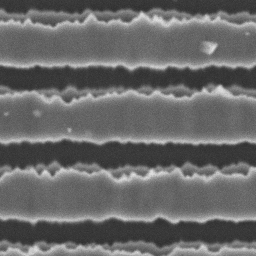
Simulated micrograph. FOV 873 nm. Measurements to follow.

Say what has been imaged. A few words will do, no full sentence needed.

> lines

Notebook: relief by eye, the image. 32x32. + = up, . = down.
................................
....+......+...++..+++..........
++++++++++++++++++++++++++++++++
++++++++++++++++++++++++++++++++
++++++++++++++++++++++++++++++++
++++++++++++++++++++++++++++++++
++++++++++++++++++++++++++++++++
++++++++++++++++++++++++++++++++
................+..++...+.......
................................
................................
++.++++.++++++++++++++++++++++++
++++++++++++++++++++++++++++++++
++++++++++++++++++++++++++++++++
++++++++++++++++++++++++++++++++
++++++++++++++++++++++++++++++++
++++++++++++++++++++++++++++++++
+++++++...++++.+++++++++++++++++
................................
................................
................................
++++++++++++++++++++++++++++++++
++++++++++++++++++++++++++++++++
++++++++++++++++++++++++++++++++
++++++++++++++++++++++++++++++++
++++++++++++++++++++++++++++++++
++++++++++++++++++++++++++++++++
...++.++++..+.....+..++.++...+..
................................
................................
+....+..+.......+++...+++....++.
++++++++++++++++++++++++++++++++